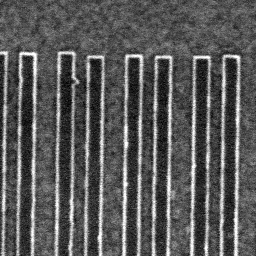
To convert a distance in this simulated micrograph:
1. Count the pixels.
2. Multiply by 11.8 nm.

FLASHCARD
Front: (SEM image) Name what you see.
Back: parallel lines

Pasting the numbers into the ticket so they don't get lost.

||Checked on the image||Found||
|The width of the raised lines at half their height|186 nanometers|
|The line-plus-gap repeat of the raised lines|401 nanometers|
